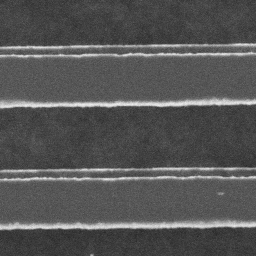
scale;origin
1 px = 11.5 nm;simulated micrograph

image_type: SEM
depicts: lines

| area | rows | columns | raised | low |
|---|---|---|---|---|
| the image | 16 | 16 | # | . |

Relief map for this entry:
................
................
................
################
################
################
#############...
................
................
................
................
################
################
################
................
................